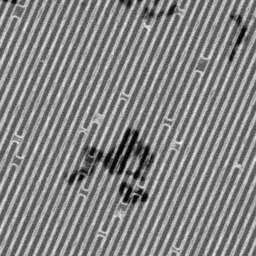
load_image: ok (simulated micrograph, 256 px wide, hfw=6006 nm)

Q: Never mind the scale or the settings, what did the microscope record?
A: parallel lines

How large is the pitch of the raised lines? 193 nm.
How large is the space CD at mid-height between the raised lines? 162 nanometres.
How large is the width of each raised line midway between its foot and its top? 32.3 nm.